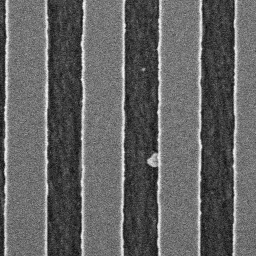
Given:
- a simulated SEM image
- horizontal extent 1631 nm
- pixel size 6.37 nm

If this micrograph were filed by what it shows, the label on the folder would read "lines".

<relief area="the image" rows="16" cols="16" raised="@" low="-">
@@@--@@@--@@@--@
@@@--@@@--@@@--@
@@@--@@@--@@@--@
@@@--@@@--@@@--@
@@@--@@@--@@@--@
@@@--@@@--@@@--@
@@@--@@@--@@@--@
@@@--@@@--@@@--@
@@@--@@@--@@@--@
@@@--@@@--@@@--@
@@@--@@@--@@@--@
@@@--@@@--@@@--@
@@@--@@@--@@@--@
@@@--@@@--@@@--@
@@@--@@@--@@---@
@@@--@@@--@@---@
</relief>